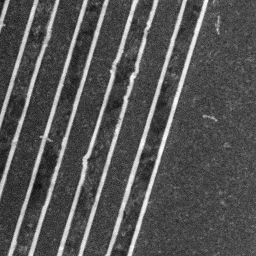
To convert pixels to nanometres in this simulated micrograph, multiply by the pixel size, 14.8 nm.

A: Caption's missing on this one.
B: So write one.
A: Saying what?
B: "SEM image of parallel lines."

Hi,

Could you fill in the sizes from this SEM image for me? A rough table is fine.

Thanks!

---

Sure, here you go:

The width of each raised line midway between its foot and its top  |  312 nm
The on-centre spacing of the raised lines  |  0.7 microns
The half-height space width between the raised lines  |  390 nm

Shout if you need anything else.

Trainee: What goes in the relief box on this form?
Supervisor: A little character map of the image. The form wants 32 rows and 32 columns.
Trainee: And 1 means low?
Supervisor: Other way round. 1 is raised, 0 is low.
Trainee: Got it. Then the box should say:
10001110000110000110000111000000
10001110001110001110000110000000
00001100001110001110001110000000
00001100001100001100001110000000
00011100011100001100001100000000
00011100011100011100001100000000
00011000011000011100011100000000
00111000011000011000011100000000
00111000111000111000011000000000
00110000111000111000111000000000
01110000110000110000111000000000
01110001110001110000110000000000
01100001110001110001110000000000
11100001100001110001110000000000
11100011100001100001100000000000
11100011100011100011100000000000
11000011100011100011100000000000
11000111000011000011100000000000
11000111000111000011000000000000
10000111000111000111000000000000
10000110000111000111000000000000
10001110001110000110000000000000
10001110001110001110000000000000
00001110001110001110000000000000
00011100001100001100000000000000
00011100011100011100000000000000
00011100011100011100000000000000
00111000011000011100000000000000
00111000111000011000000000000000
00111000111000111000000000000000
00110000111000111000000000000000
01110001110000110000000000000000